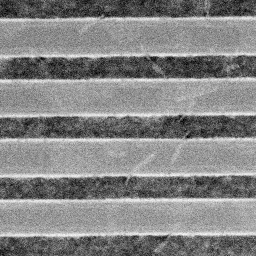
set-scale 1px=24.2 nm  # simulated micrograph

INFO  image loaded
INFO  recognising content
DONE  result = lines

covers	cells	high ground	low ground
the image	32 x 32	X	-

--------------------------------
--------------------------------
XXXXXXXXXXXXXXXXXXXXXXXXXXXXXXXX
XXXXXXXXXXXXXXXXXXXXXXXXXXXXXXXX
XXXXXXXXXXXXXXXXXXXXXXXXXXXXXXXX
XXXXXXXXXXXXXXXXXXXXXXXXXXXXXXXX
XXXXXXXXXXXXXXXXXXXXXXXXXXXXXXXX
--------------------------------
--------------------------------
--------------------------------
XXXXXXXXXXXXXXXXXXXXXXXXXXXXXXXX
XXXXXXXXXXXXXXXXXXXXXXXXXXXXXXXX
XXXXXXXXXXXXXXXXXXXXXXXXXXXXXXXX
XXXXXXXXXXXXXXXXXXXXXXXXXXXXXXXX
XXXX----------------------------
--------------------------------
--------------------------------
XXXXXXXXXXXXXXXXXXXXXXXXXXXXXXXX
XXXXXXXXXXXXXXXXXXXXXXXXXXXXXXXX
XXXXXXXXXXXXXXXXXXXXXXXXXXXXXXXX
XXXXXXXXXXXXXXXXXXXXXXXXXXXXXXXX
XXXXXXXXXXXXXXXXXXXXXXXXXXXXXXXX
--------------------------------
--------------------------------
--------------------------------
XXXXXXXXXXXXXXXXXXXXXXXXXXXXXXXX
XXXXXXXXXXXXXXXXXXXXXXXXXXXXXXXX
XXXXXXXXXXXXXXXXXXXXXXXXXXXXXXXX
XXXXXXXXXXXXXXXXXXXXXXXXXXXXXXXX
--------------------------------
--------------------------------
--------------------------------